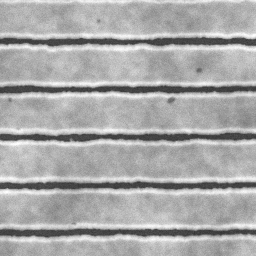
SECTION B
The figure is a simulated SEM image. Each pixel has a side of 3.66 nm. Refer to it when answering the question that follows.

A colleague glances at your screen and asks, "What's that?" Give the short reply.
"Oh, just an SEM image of lines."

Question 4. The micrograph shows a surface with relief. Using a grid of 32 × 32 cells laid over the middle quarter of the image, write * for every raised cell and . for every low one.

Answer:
********************************
********************************
********************************
********************************
********************************
................................
................................
*****************....*****...***
********************************
********************************
********************************
********************************
********************************
********************************
********************************
********************************
********************************
................................
................................
.......*************....**....**
********************************
********************************
********************************
********************************
********************************
********************************
********************************
********************************
********************************
................................
................................
....********.....*******........